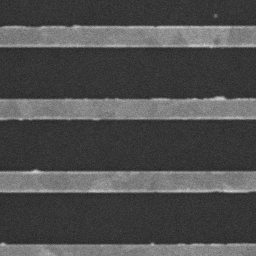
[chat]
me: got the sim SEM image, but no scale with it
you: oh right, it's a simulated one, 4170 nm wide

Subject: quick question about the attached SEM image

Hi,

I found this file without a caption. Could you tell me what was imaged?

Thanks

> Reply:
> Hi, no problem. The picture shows lines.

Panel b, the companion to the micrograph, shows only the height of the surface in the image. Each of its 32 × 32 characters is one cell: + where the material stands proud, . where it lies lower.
................................
................................
................................
++++++++++++++++++++++++++++++++
++++++++++++++++++++++++++++++++
++++++++++++++++++++++++++++++++
................................
................................
................................
................................
................................
................................
++++++++++++++++++++++++++++++++
++++++++++++++++++++++++++++++++
++++++++++++++++++++++++++++++++
................................
................................
................................
................................
................................
................................
................................
++++++++++++++++++++++++++++++++
++++++++++++++++++++++++++++++++
................................
................................
................................
................................
................................
................................
................................
++++++++++++++++++++++++++++++++